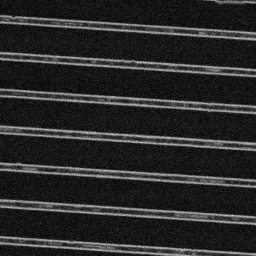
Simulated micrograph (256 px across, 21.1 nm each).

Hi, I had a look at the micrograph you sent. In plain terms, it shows parallel lines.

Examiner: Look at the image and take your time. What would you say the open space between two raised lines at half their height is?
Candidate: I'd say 0.632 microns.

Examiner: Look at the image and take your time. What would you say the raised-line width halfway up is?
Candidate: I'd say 134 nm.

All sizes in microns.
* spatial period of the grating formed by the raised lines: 0.776